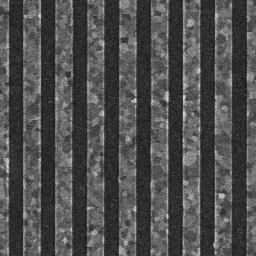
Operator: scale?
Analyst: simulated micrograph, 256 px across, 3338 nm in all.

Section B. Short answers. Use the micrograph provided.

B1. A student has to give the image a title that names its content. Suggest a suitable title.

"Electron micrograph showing parallel lines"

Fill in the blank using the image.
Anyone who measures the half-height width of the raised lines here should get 215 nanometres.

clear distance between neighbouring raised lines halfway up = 0.202 um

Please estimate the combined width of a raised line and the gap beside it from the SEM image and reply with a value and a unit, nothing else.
416 nm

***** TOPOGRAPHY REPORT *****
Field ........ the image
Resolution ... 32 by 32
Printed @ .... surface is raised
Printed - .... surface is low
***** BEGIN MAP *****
@--@@--@@--@@--@@--@@--@@--@@--@
@--@@--@@--@@--@@--@@--@@--@@--@
@--@@--@@--@@--@@--@@--@@--@@--@
@--@@--@@--@@--@@--@@--@@--@@--@
@--@@--@@--@@--@@--@@--@@--@@--@
@--@@--@@--@@--@@--@@--@@--@@--@
@--@@--@@--@@--@@--@@--@@--@@--@
@--@@--@@--@@--@@--@@--@@--@@--@
@--@@--@@--@@--@@--@@--@@--@@--@
@--@@--@@--@@--@@--@@--@@--@@--@
@--@@--@@--@@--@@--@@--@@--@@--@
@--@@--@@--@@--@@--@@--@@--@@--@
@--@@--@@--@@--@@--@@--@@--@@--@
@--@@--@@--@@--@@--@@--@@--@@--@
@--@@--@@--@@--@@--@@--@@--@@--@
@--@@--@@--@@--@@--@@--@@--@@--@
@--@@--@@--@@--@@--@@--@@--@@--@
@--@@--@@--@@--@@--@@--@@--@@--@
@--@@--@@--@@--@@--@@--@@--@@--@
@--@@--@@--@@--@@--@@--@@--@@--@
@--@@--@@--@@--@@--@@--@@--@@--@
@--@@--@@--@@--@@--@@--@@--@@--@
@--@@--@@--@@--@@--@@--@@--@@--@
@--@@--@@--@@--@@--@@--@@--@@--@
@--@@--@@--@@--@@--@@--@@--@@--@
@--@@--@@--@@--@@--@@--@@--@@--@
@--@@--@@--@@--@@--@@--@@--@@--@
@--@@--@@--@@--@@--@@--@@--@@--@
@--@@--@@--@@--@@--@@--@@--@@--@
@--@@--@@--@@--@@--@@--@@--@@--@
@--@@--@@--@@--@@--@@--@@--@@--@
@--@@--@@--@@--@@--@@--@@--@@--@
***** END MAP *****